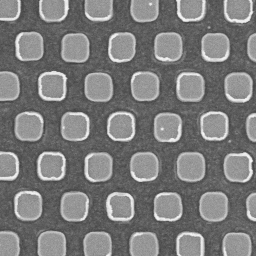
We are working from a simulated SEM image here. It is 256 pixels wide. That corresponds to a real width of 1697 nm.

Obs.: a regular array of raised bodies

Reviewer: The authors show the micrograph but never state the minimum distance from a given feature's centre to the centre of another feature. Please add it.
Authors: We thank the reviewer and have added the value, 0.301 um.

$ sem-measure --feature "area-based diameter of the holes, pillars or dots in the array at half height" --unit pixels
30.2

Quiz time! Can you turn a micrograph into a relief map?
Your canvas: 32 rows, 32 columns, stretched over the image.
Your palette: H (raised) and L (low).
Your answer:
HHLLLHHHLLLHHHLLHHHHLLHHHHLLHHHH
HHLLLHHHLLLHHHLLHHHHLLHHHHLLHHHH
HHLLLLHHLLLHHLLLLHHLLLLHHLLLLHHL
LLLLLLLLLLLLLLLLLLLLLLLLLLLLLLLL
LLHHHLLLHHHLLLHHHLLLHHLLLLHHLLLH
LLHHHLLLHHHLLLHHHLLHHHHLLHHHHLLH
LLHHHLLLHHHLLLHHHLLHHHHLLHHHHLLH
LLLHLLLLHHHLLLHHLLLLHHLLLLHHLLLL
LLLLLLLLLLLLLLLLLLLLLLLLLLLLLLLL
HHLLLHHHLLLHHHLLLHHHLLHHHLLLHHHL
HHLLLHHHLLLHHHLLHHHHLLHHHLLLHHHH
HHLLLHHHLLLHHHLLHHHHLLHHHLLLHHHL
HHLLLLHHLLLHHLLLLHLLLLLHHLLLLHHL
LLLLLLLLLLLLLLLLLLLLLLLLLLLLLLLL
LLHHHLLLHHHLLLHHHLLLHHLLLHHHLLLH
LLHHHLLLHHHLLHHHHLLHHHHLLHHHLLLH
LLHHHLLLHHHLLHHHHLLHHHHLLHHHLLLH
LLLHHLLLLHLLLLHHLLLLHHLLLLLLLLLH
LLLLLLLLLLLLLLLLLLLLLLLLLLLLLLLL
HHLLLHHHLLLHHHLLLHHLLLLHHLLLHHHL
HHLLLHHHLLLHHHLLHHHHLLHHHHLLHHHH
HHLLLHHHLLLHHHLLHHHHLLHHHHLLHHHH
LLLLLHHLLLLHHLLLLHHLLLLHHLLLLHHL
LLLLLLLLLLLLLLLLLLLLLLLLLLLLLLLL
LLHHHLLLHHHLLLHHLLLLHHLLLHHHLLLH
LLHHHLLLHHHLLHHHHLLHHHHLLHHHLLLH
LLHHHLLLHHHLLHHHHLLHHHHLLHHHLLLH
LLLHLLLLHHLLLLHHLLLLHHLLLLHHLLLL
LLLLLLLLLLLLLLLLLLLLLLLLLLLLLLLL
HHLLLHHHLLLHHHLLLHHLLLHHHLLLHHHL
HHLLLHHHLLLHHHLLHHHHLLHHHHLLHHHL
HHLLLHHHLLLHHHLLHHHHLLHHHHLLHHHL